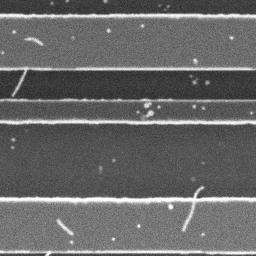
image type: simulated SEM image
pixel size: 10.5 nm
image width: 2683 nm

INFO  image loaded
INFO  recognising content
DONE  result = lines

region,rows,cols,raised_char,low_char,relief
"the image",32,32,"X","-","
--------------------------------
--------------------------------
XXXXXXXXXXXXXXXXXXXXXXXXXXXXXXXX
XXXXXXXXXXXXXXXXXXXXXXXXXXXXXXXX
XXXXXXXXXXXXXXXXXXXXXXXXXXXXXXXX
XXXXXXXXXXXXXXXXXXXXXXXXXXXXXXXX
XXXXXXXXXXXXXXXXXXXXXXXXXXXXXXXX
XXXXXXXXXXXXXXXXXXXXXXXXXXXXXXXX
XXXXXXXXXXXXXXXXXXXXXXXXXXXXXXXX
--------------------------------
--------------------------------
--------------------------------
XXXX---XXXXXX-XX-XXXXX----------
XXXXXXXXXXXXXXXXXXXXXXXXXXXXXXXX
XXXXXXXXXXXXXXXXXXXXXXXXXXXXXXXX
--------------------------------
--------------------------------
--------------------------------
--------------------------------
--------------------------------
--------------------------------
--------------------------------
--------------------------------
--------------------------------
--------------------------------
XXXXXXXXXXXXXXXXXXXXXXXXXXXXXXXX
XXXXXXXXXXXXXXXXXXXXXXXXXXXXXXXX
XXXXXXXXXXXXXXXXXXXXXXXXXXXXXXXX
XXXXXXXXXXXXXXXXXXXXXXXXXXXXXXXX
XXXXXXXXXXXXXXXXXXXXXXXXXXXXXXXX
XXXXXXXXXXXXXXXXXXXXXXXXXXXXXXXX
XXXXXXXXXXXXXXXXXXXXXXXXXXXXXXXX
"